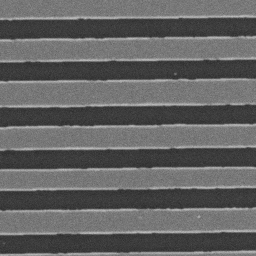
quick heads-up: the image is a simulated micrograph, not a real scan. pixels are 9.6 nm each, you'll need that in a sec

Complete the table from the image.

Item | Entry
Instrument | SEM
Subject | lines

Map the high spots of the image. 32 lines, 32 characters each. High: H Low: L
HHHHHHHHHHHHHHHHHHHHHHHHHHHHHHHH
HHHHHHHHHHHHHHHHHHHHHHHHHHHHHHHH
LLLLLLLLLLLLLLLLLLLLLLLLLLLLLLLL
LLLLLLLLLLLLLLLLLLLLLLLLLLLLLLLL
LLLLLLLLLLLLLLLLLLLLLLLLLLLLLLLL
HHHHHHHHHHHHHHHHHHHHHHHHHHHHHHHH
HHHHHHHHHHHHHHHHHHHHHHHHHHHHHHHH
HHHHHHHHHHLLLLLLLLLLLLLLLLLLLLLL
LLLLLLLLLLLLLLLLLLLLLLLLLLLLLLLL
LLLLLLLLLLLLLLLLLLLLLLLLLLLLLLLL
HHHHHHHHHHHHHHHHHHHHHHHHHHHHHHHH
HHHHHHHHHHHHHHHHHHHHHHHHHHHHHHHH
HHHHHHHHHHHHHHHHHHHHHHHHHHHHHHHH
LLLLLLLLLLLLLLLLLLLLLLLLLLLLLLLL
LLLLLLLLLLLLLLLLLLLLLLLLLLLLLLLL
LLLLLLLLLLLLLLLLLLLLLLLLLLLLLLLL
HHHHHHHHHHHHHHHHHHHHHHHHHHHHHHHH
HHHHHHHHHHHHHHHHHHHHHHHHHHHHHHHH
HHHHHHHHHHHHHHHHHHHLLLLLLLLLLLLL
LLLLLLLLLLLLLLLLLLLLLLLLLLLLLLLL
LLLLLLLLLLLLLLLLLLLLLLLLLLLLLLLL
HHHHHHHHHHHHHHHHHHHHHHHHHHHHHHHH
HHHHHHHHHHHHHHHHHHHHHHHHHHHHHHHH
HHHHHHHHHHHHHHHHHHHHHLLLLLLLLLLL
LLLLLLLLLLLLLLLLLLLLLLLLLLLLLLLL
LLLLLLLLLLLLLLLLLLLLLLLLLLLLLLLL
HHHHHHHHHHHHHHHHHHHHHHHHHHHHHHHH
HHHHHHHHHHHHHHHHHHHHHHHHHHHHHHHH
HHHHHHHHHHHHHHHHHHHHHHHHHHHHHHHH
LLLLLLLLLLLLLLLLLLLLLLLLLLLLLLLL
LLLLLLLLLLLLLLLLLLLLLLLLLLLLLLLL
LLLLLLLLLLLLLLLLLLLLLLLLLLLLLHHH